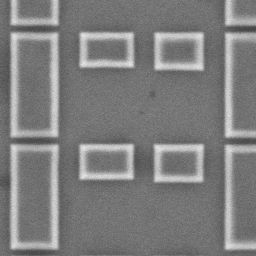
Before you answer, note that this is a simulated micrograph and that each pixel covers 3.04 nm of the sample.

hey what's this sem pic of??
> wiring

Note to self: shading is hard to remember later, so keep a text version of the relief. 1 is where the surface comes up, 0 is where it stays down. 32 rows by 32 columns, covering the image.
00111110000000000000000000000111
00111110000000000000000000000111
00111110000000000000000000000111
00000000000000000000000000000000
00110000000000000000000000000000
00111110001111110000111110000111
00111110001111110000111110000111
00111110001111110000111110000111
00111110000000000000000000000111
00111110000000000000000000000111
00111110000000000000000000000111
00111110000000000000000000000111
00111110000000000000000000000111
00111110000000000000000000000111
00111110000000000000000000000111
00111110000000000000000000000111
00111110000000000000000000000111
00000000000000000000000000000000
00000000000110010000000000000000
00111110001111110000111110000111
00111110001111110000111110000111
00111110001111110000111110000111
00111110000000000000000000000111
00111110000000000000000000000111
00111110000000000000000000000111
00111110000000000000000000000111
00111110000000000000000000000111
00111110000000000000000000000111
00111110000000000000000000000111
00111110000000000000000000000111
00111110000000000000000000000111
00000000000000000000000000000000